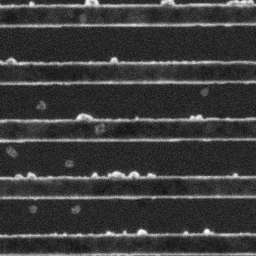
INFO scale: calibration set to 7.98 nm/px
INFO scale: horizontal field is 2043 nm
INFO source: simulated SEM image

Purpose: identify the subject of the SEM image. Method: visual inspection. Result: lines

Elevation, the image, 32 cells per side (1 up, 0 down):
00000000000100000000110000000001
11111111111111111111111111111111
11111111111111111111111111111111
00000000000000000000000000000000
00000000000000000000000000000000
00000000000000000000000000000000
00000000000000000000000000000000
00000000000000000000000000000000
11111111111111111111111111111111
11111111111111111111111111111111
00000000000000000000000000000000
00000000000000000000000000000000
00000000000000000000000000000000
00000000000000000000000000000000
00000000001000000000000000000000
11111111111111111111111111111111
11111111111111111111111111111111
11111111111111111111110001100000
00000000000000000000000000000000
00000000000000000000000000000000
00000000000000000000000000000000
00000000000000000000000000000000
11111111111111111111111111111111
11111111111111111111111111111111
11111111111111111111111111111111
00000000000000000000000000000000
00000000000000000000000000000000
00000000000000000000000000000000
00000000000000000000000000000000
11111111111111111111111111111111
11111111111111111111111111111111
11111111111111111111111111111111